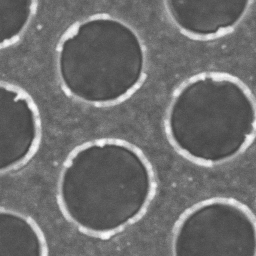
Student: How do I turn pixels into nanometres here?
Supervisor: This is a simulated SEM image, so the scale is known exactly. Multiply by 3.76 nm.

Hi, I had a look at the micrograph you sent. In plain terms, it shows holes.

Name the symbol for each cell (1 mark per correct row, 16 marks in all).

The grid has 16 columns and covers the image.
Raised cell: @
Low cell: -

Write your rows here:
--@@@@@@@@@----@
--@@@---@@@----@
@@@@-----@@@@@@@
@@@@-----@@@@@@@
@@@@-----@@@@@@@
@@@@----@@@@---@
--@@@@@@@@@-----
--@@@@@@@@@-----
--@@@@@@@@@----@
--@@@---@@@@---@
@@@@-----@@@@@@@
@@@@-----@@@@@@@
@@@@-----@@@@@@@
-@@@----@@@@---@
--@@@@@@@@@-----
---@@@@@@@@-----